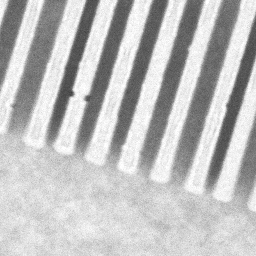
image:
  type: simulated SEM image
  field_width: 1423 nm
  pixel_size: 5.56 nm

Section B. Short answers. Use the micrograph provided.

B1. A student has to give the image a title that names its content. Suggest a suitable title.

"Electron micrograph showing parallel lines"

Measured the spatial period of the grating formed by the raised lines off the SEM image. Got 184 nm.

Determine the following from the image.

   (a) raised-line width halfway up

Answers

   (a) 107 nm